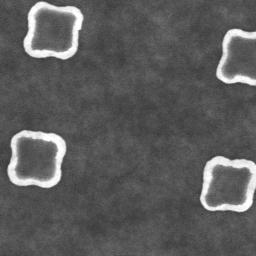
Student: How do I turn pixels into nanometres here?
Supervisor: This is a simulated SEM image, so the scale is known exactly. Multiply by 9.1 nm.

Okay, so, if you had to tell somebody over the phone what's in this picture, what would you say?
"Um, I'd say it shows raised bodies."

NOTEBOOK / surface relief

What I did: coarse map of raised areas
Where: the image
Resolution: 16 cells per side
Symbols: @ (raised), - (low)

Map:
--@@------------
--@@@-----------
--@@@---------@@
--------------@@
--------------@@
----------------
----------------
----------------
-@@-------------
-@@@------------
-@@@---------@@@
-------------@@@
-------------@@@
----------------
----------------
----------------